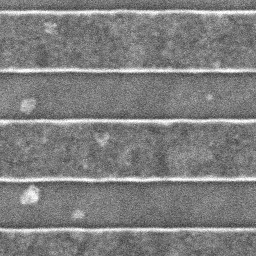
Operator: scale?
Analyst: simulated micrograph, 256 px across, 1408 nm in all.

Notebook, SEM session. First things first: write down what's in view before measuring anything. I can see wiring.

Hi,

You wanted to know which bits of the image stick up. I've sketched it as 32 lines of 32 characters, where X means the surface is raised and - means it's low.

--------------------------------
XXXXXXXXXXXXXXXXXXXXXXXXXXXXXXXX
XXXXXXXXXXXXXXXXXXXXXXXXXXXXXXXX
XXXXXXXXXXXXXXXXXXXXXXXXXXXXXXXX
XXXXXXXXXXXXXXXXXXXXXXXXXXXXXXXX
XXXXXXXXXXXXXXXXXXXXXXXXXXXXXXXX
XXXXXXXXXXXXXXXXXXXXXXXXXXXXXXXX
XXXXXXXXXXXXXXXXXXXXXXXXXXXXXXXX
XXXXXXXXXXXXXXXXXXXXXXXXXXXXXXXX
--------------------------------
--------------------------------
--------------------------------
--------------------------------
--------------------------------
--------------------------------
XXXXXXXXXXXXXXXXXXXXXXXXXXXXXXXX
XXXXXXXXXXXXXXXXXXXXXXXXXXXXXXXX
XXXXXXXXXXXXXXXXXXXXXXXXXXXXXXXX
XXXXXXXXXXXXXXXXXXXXXXXXXXXXXXXX
XXXXXXXXXXXXXXXXXXXXXXXXXXXXXXXX
XXXXXXXXXXXXXXXXXXXXXXXXXXXXXXXX
XXXXXXXXXXXXXXXXXXXXXXXXXXXXXXXX
-XXXX-----XXXX--XXX-------------
--------------------------------
--------------------------------
--------------------------------
--------------------------------
--------------------------------
--------------------------------
XXXXXXXXXXXXXXXXXXXXXXXXXXXXXXXX
XXXXXXXXXXXXXXXXXXXXXXXXXXXXXXXX
XXXXXXXXXXXXXXXXXXXXXXXXXXXXXXXX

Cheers